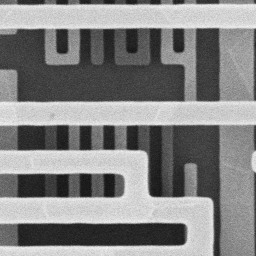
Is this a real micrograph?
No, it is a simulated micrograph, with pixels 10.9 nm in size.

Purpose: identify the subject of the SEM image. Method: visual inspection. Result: wiring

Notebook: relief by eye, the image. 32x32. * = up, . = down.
................................
********************************
********************************
*****************...****....****
................................
................................
................................
................................
................................
................................
................................
................................
................................
********************************
********************************
********************************
................................
................................
................................
******************..............
******************..............
******************..............
................**..............
................**..............
...............****.............
***************************.....
***************************.....
***************************.....
.......................****.....
.......................****.....
.......................****.....
***************************.....